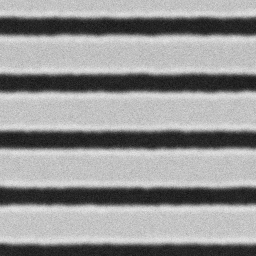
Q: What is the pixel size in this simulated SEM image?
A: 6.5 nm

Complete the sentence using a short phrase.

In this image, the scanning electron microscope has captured lines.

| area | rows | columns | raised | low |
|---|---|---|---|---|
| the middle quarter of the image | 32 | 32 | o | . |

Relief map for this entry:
oooooooooooooooooooooooooooooooo
oooooooooooooooooooooooooooooooo
......................o.........
................................
................................
................................
................................
oooooooooooooooooooooooooooooooo
oooooooooooooooooooooooooooooooo
oooooooooooooooooooooooooooooooo
oooooooooooooooooooooooooooooooo
oooooooooooooooooooooooooooooooo
oooooooooooooooooooooooooooooooo
oooooooooooooooooooooooooooooooo
oooooooooooooooooooooooooooooooo
oooooooooooooooooooooooooooooooo
.....oo.oo..o........o........oo
................................
................................
................................
................................
...oo...................o...o..o
oooooooooooooooooooooooooooooooo
oooooooooooooooooooooooooooooooo
oooooooooooooooooooooooooooooooo
oooooooooooooooooooooooooooooooo
oooooooooooooooooooooooooooooooo
oooooooooooooooooooooooooooooooo
oooooooooooooooooooooooooooooooo
oooooooooooooooooooooooooooooooo
oooooooooooooooooooooooooooooooo
................................